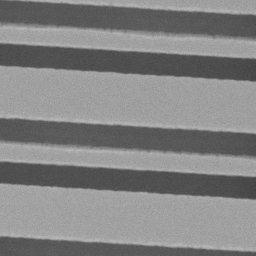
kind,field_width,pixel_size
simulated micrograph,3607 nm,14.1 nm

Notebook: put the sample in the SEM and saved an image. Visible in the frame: lines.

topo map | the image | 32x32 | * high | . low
.........***********************
.........................*******
................................
********........................
**********************..........
.*******************************
...................*************
................................
*****...........................
********************............
********************************
********************************
********************************
********************************
********************************
.............*******************
.............................***
................................
*********.......................
****************************....
.....***************************
.......................*********
................................
*********.......................
************************........
********************************
********************************
********************************
********************************
********************************
.................***************
................................